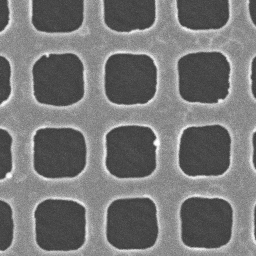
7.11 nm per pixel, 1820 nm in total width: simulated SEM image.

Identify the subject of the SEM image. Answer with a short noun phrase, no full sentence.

a regular array of holes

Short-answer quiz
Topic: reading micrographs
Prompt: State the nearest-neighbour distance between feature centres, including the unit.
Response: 510 nanometres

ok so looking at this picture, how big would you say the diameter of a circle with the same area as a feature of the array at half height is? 395 nm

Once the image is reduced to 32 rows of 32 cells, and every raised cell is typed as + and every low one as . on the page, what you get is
.+++......+++.......++.......++.
.+++.......++.......++.......++.
.+++......+++......+++.......+++
.+++......++++....+++++.....++++
++++++++++++++++++++++++++++++++
++++++++++++++++++++++++++++++++
+++++++++++++++++++++++++..+++++
.++++.....+++......+++......++++
.+++......+++.......++.......++.
.+++......+++.......++.......++.
.+++.......++.......++.......++.
.+++.......++......+++.......+++
.++++.....++++.....++++.....++++
++++++++++++++++++++++++++++++++
++++++++++++++++++++++++++++++++
++++++++++++++++++++++++++++++++
.++++.....++++.....++++......+++
.+++.......++......++++......++.
.+++.......++.......++.......+++
.+++.......++.......++.......+++
..++.......++.......++.......+++
.++++.....++++.....++++.....++++
++++++++++++++++++++++++++++++++
++++++++++++++++++++++++++++++++
++++++++++++++++++++++++++++++++
.++++.....++++.....++++......+++
.+++.......++.......++.......+++
..++.......++.......+++......+++
..++.......++.......+++......+++
..++.......++.......+++......+++
.++++.....++++.....++++.....++++
++++++++++++++++++++++++++++++++